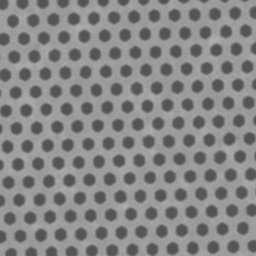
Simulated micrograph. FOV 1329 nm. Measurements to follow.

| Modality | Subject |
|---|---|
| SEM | a regular array of holes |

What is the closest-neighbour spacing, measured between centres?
104 nm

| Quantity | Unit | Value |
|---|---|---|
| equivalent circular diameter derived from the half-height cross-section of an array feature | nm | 62.2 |